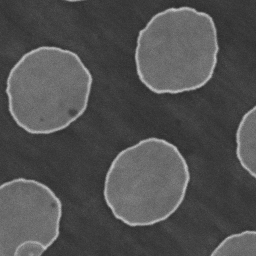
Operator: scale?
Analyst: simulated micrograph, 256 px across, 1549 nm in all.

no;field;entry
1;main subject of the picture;raised bodies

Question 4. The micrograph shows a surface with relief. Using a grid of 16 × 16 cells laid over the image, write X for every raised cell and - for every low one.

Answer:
----------------
---------XXXX---
---------XXXXX--
--XXX----XXXXX--
-XXXX----XXXX---
XXXXXX---XXX----
-XXXX-----------
-XXXX----------X
---------------X
--------XXX----X
-------XXXXX---X
XXX----XXXXX----
XXXX---XXXX-----
XXXX---XXX------
XXXX------------
X-------------XX